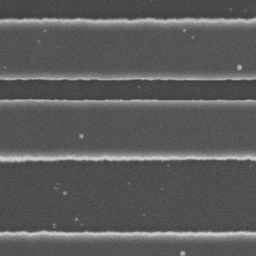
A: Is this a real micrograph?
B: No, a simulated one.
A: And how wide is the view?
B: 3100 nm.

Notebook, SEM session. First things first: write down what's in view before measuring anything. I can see lines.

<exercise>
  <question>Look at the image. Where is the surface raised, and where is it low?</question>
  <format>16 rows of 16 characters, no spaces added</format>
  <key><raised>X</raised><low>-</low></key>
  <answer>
----------------
XXXXXXXXXXXXXXXX
XXXXXXXXXXXXXXXX
XXXXXXXXXXXXXXXX
XXXXXXXXXXXXXXXX
XXXXXXXXXXXXXXXX
XXXXXXXXXXXXXXXX
XXXXXXXXXXXXXXXX
XXXXXXXXXXXXXXXX
XXXXXXXXXXXXXXXX
----------------
----------------
----------------
----------------
----------------
XXXXXXXXXXXXXXXX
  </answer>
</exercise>